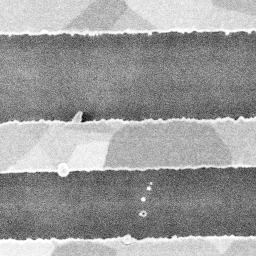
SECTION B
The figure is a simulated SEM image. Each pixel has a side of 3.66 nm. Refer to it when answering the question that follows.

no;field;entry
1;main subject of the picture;lines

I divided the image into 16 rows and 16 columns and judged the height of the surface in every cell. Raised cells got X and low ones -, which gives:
XXXXXXXXXXXXXXXX
XXXXXXXXXXXXXXXX
----------------
----------------
----------------
----------------
----------------
----X-XX-XXXXXXX
XXXXXXXXXXXXXXXX
XXXXXXXXXXXXXXXX
XXXXXXXXXXXX----
----------------
----------------
----------------
----------------
XXXXXXXXXXXXXXXX